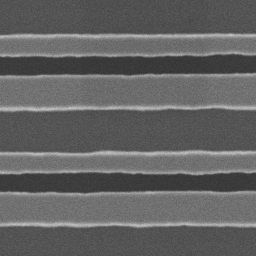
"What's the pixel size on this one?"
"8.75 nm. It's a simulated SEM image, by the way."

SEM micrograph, lines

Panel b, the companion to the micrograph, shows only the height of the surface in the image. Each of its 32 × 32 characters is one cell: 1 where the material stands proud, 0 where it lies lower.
00000000000000000000000000000000
00000000000000000000000000000000
00000000000000000000000000000000
00000000000000000000000000000000
00000011110000011111111111111111
11111111111111111111111111111111
11111111111111111111111111111111
00000000000000000000000000000000
00000000000000000000000000000000
00001111111111111111111111111111
11111111111111111111111111111111
11111111111111111111111111111111
11111111111111111111111111111111
11111111111111101111000110000001
00000000000000000000000000000000
00000000000000000000000000000000
00000000000000000000000000000000
00000000000000000000000000000000
00000000000000000000000000000000
11111111111111111111111111111111
11111111111111111111111111111111
11111111110001011111111111111011
00000000000000000000000000000000
00000000000000000000000000000000
11111111111111111111111111111111
11111111111111111111111111111111
11111111111111111111111111111111
11111111111111111111111111111111
00000000000000000000000000000000
00000000000000000000000000000000
00000000000000000000000000000000
00000000000000000000000000000000